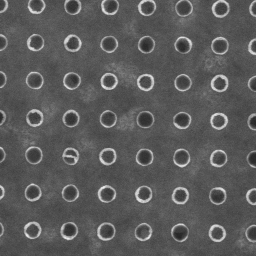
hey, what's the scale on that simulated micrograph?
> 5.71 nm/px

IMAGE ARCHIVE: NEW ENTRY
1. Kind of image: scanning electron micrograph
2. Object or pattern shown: a regular array of raised bodies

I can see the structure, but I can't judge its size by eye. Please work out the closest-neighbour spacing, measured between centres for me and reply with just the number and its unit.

210 nm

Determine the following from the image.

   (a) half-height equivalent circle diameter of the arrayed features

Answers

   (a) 95.5 nm